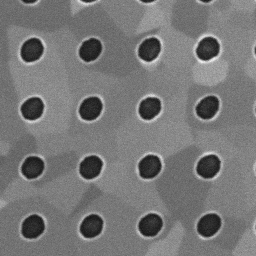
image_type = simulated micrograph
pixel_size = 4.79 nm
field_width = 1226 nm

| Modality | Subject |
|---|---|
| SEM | a regular array of holes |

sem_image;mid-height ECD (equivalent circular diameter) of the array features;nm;118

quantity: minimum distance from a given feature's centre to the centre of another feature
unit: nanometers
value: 279